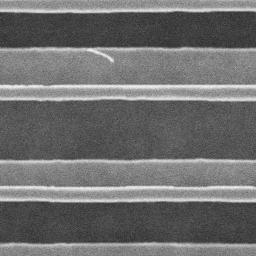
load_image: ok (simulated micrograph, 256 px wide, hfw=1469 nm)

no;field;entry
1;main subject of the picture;lines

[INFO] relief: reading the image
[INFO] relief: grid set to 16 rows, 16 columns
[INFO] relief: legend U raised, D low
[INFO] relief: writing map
UUUUUUUUUUUUUUUU
DDDDDDDDDDDDDDDD
DDDDDDDDDDDDDDDD
UUUUUUUUUUUUUUUU
UUUUUUUUUUUUUUUU
UUUUUUUUUUUUUUUU
DDDDDDDDDDDDDDDD
DDDDDDDDDDDDDDDD
DDDDDDDDDDDDDDDD
DDDDDDDDDDDDDDDD
UUUUUUUUUUUUUUUU
UUUUUUUUUUUUUUUU
UUUUUUUUUUUUUUUU
DDDDDDDDDDDDDDDD
DDDDDDDDDDDDDDDD
UUUUUUUUUUUUUUUU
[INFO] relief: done